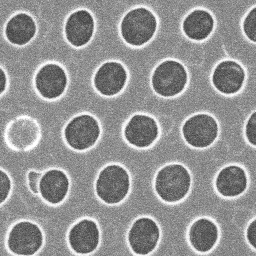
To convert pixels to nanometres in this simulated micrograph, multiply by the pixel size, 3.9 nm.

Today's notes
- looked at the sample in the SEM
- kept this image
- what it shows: a regular array of holes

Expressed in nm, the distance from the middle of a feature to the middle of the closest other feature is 230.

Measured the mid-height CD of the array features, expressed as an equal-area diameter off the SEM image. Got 132 nanometres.